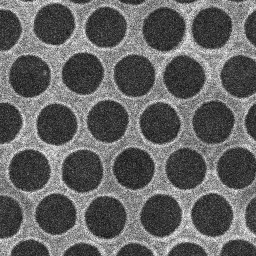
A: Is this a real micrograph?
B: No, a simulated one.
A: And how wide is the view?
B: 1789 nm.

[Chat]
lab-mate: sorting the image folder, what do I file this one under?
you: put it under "a regular array of holes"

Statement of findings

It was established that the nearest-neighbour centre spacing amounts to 358 nanometres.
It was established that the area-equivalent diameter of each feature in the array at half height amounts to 306 nanometers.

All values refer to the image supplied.